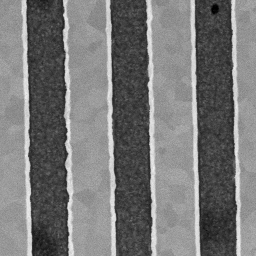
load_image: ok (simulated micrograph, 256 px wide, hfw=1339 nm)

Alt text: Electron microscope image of one or a few lines or trenches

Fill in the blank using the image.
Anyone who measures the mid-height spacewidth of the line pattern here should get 40.7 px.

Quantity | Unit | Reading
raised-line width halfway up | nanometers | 224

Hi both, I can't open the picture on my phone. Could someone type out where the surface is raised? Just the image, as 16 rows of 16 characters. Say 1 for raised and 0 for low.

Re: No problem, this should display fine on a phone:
1100111001110001
1100111001110001
1100111001110001
1100111001110001
1100111001110001
1100111001110001
1100111001110001
1100111001110001
1100111001110001
1100111001110001
1100111000110001
1100111000110001
1100111000110001
1100111000110001
1100111000110001
1100111000110001